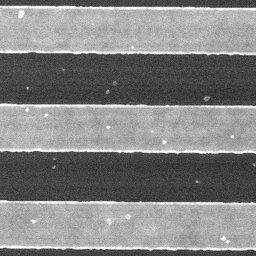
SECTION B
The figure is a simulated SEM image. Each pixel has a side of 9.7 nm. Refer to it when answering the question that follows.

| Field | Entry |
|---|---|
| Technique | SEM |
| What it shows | lines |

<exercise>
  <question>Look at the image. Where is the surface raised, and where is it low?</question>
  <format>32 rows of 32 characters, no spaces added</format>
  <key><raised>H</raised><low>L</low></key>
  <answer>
LLLLLLLLLLLLLLLLLLLLLLLLLLLLLLLL
HHHHHHHHHHHHHHHHHHHHHHHHHHHHHHHH
HHHHHHHHHHHHHHHHHHHHHHHHHHHHHHHH
HHHHHHHHHHHHHHHHHHHHHHHHHHHHHHHH
HHHHHHHHHHHHHHHHHHHHHHHHHHHHHHHH
HHHHHHHHHHHHHHHHHHHHHHHHHHHHHHHH
HHHHHHHHHHHHHHHHHHHHHHHHHHHHHHHH
LLLLLLLLLLLLLLLLLLLLLLLLLLLLLLLL
LLLLLLLLLLLLLLLLLLLLLLLLLLLLLLLL
LLLLLLLLLLLLLLLLLLLLLLLLLLLLLLLL
LLLLLLLLLLLLLLLLLLLLLLLLLLLLLLLL
LLLLLLLLLLLLLLLLLLLLLLLLLLLLLLLL
LLLLLLLLLLLLLLLLLLLLLLLLLLLLLLLL
HHHHHHHHHHHHHHHHHHHHHHHHHHHHHHHH
HHHHHHHHHHHHHHHHHHHHHHHHHHHHHHHH
HHHHHHHHHHHHHHHHHHHHHHHHHHHHHHHH
HHHHHHHHHHHHHHHHHHHHHHHHHHHHHHHH
HHHHHHHHHHHHHHHHHHHHHHHHHHHHHHHH
HHHHHHHHHHHHHHHHHHHHHHHHHHHHHHHH
LLLLLLLLLLLLLLLLLLLLLLLLLLLLLLLL
LLLLLLLLLLLLLLLLLLLLLLLLLLLLLLLL
LLLLLLLLLLLLLLLLLLLLLLLLLLLLLLLL
LLLLLLLLLLLLLLLLLLLLLLLLLLLLLLLL
LLLLLLLLLLLLLLLLLLLLLLLLLLLLLLLL
LLLLLLLLLLLLLLLLLLLLLLLLLLLLLLLL
HHHHHHHHHHHHHHHHHHHHHHHHHHHHHHHH
HHHHHHHHHHHHHHHHHHHHHHHHHHHHHHHH
HHHHHHHHHHHHHHHHHHHHHHHHHHHHHHHH
HHHHHHHHHHHHHHHHHHHHHHHHHHHHHHHH
HHHHHHHHHHHHHHHHHHHHHHHHHHHHHHHH
HHHHHHHHHHHHHHHHHHHHHHHHHHHHHHHH
LLLLLLLLLLLLLLLLLLLLLLLLLLLLLLLL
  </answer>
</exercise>